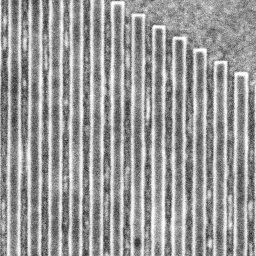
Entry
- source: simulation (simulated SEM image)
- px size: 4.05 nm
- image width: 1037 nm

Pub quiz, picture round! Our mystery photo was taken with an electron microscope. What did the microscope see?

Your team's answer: parallel lines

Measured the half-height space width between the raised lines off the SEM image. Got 35 nanometers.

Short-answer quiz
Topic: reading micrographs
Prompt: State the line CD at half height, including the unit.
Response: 49.7 nanometres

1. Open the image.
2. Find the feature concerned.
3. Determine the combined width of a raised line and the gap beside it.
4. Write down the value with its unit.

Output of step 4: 83.5 nanometers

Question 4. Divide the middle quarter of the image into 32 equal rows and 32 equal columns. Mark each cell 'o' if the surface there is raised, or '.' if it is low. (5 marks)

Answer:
..oo...ooo..ooo..ooo..ooo..ooo..
..oo...ooo..ooo..ooo..ooo..ooo..
..oo...ooo..ooo..ooo..ooo..ooo..
..oo...ooo..ooo..ooo..ooo..ooo..
..oo...ooo..ooo..ooo..ooo..ooo..
..oo...ooo..ooo..ooo..ooo..ooo..
..oo...ooo..ooo..ooo..ooo..ooo..
..oo...ooo..ooo..ooo..ooo..ooo..
..oo...ooo..ooo..ooo..ooo..ooo..
..oo...ooo..ooo..ooo..ooo..ooo..
..oo...ooo..ooo..ooo..ooo..ooo..
..oo...ooo..ooo..ooo..ooo..ooo..
..oo...ooo..ooo..ooo..ooo..ooo..
..ooo..ooo..ooo..ooo..ooo..ooo..
..oo...ooo..ooo..ooo..ooo..ooo..
..oo...ooo..ooo..ooo..ooo..ooo..
..oo...ooo..ooo..ooo..ooo..ooo..
..oo...ooo..ooo..ooo..ooo..ooo..
..oo...ooo..ooo..ooo..ooo..ooo..
..oo...ooo..ooo..ooo..ooo..ooo..
..oo...ooo..ooo..ooo..ooo..ooo..
..oo...ooo..ooo..ooo..ooo..ooo..
..oo...ooo..ooo..ooo..ooo..ooo..
..oo...ooo..ooo..ooo..ooo..ooo..
..oo...ooo..ooo..ooo..ooo..ooo..
..oo...ooo..ooo..ooo..ooo..ooo..
..oo...ooo..ooo..ooo..ooo..ooo..
..oo...ooo..ooo..ooo..ooo..ooo..
..oo...ooo..ooo..ooo..ooo..ooo..
..oo...ooo..ooo..ooo..ooo..ooo..
..oo...ooo..ooo..ooo..ooo..ooo..
..oo...ooo..ooo..ooo..ooo..ooo..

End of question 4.